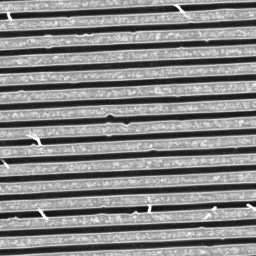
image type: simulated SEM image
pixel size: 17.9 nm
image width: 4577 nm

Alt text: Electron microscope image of parallel lines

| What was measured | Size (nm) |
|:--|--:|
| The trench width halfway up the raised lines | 105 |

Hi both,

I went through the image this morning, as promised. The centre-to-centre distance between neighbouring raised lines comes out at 323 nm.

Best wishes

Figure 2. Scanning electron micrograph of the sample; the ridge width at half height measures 205 nanometres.